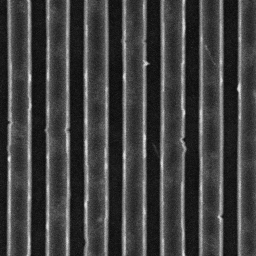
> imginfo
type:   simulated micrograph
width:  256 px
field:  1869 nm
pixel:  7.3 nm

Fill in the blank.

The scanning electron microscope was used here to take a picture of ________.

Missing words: parallel lines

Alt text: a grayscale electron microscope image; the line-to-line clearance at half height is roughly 120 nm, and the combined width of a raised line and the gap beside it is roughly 280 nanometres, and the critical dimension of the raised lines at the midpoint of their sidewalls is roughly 0.161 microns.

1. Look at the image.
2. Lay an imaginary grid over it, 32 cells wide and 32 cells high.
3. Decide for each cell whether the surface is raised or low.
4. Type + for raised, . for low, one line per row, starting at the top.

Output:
.+++..++...++..+++..+++..+++..++
.+++..++...++...++..+++..+++..++
.+++..++...++...++..+++..+++..++
.+++..++...++...++..+++..+++..++
.+++..++...++...++..+++..+++..++
.+++..++...++..+++..+++..+++..++
.+++..++...++...++..+++..+++..++
.+++..++...++...++..+++..+++..++
.+++..++...++...++..+++..+++..++
.+++..++...++..+++..+++..+++..++
.+++..++...++...++..+++..+++..++
.+++..++...++...++..+++..+++..++
.+++..++...++...++..+++..+++..++
.+++..++...++...++..+++..+++..++
.+++..++...++...++..+++..+++..++
.+++..++...++...++..+++..+++..++
.+++..++...++...++..+++..+++..++
.+++..+++..++...++..+++..+++..++
.+++..+++..++...++..+++..+++..++
.+++..+++..++..+++..+++..+++..++
.+++..+++..++...++..+++..+++..++
.+++..+++..++...++..+++..+++..++
.+++..+++..++...++..+++..+++..++
.+++..+++..++...++..+++..+++..++
.+++..+++..++...++..+++..+++..++
.+++..+++..++...++..+++..+++..++
.+++..++...++..+++..+++..+++..++
.+++..+++..++..+++..+++..+++..++
.+++..+++..++..+++..+++..+++..++
.+++..++...++..+++..+++..+++..++
.+++..++...++..+++..+++..+++..++
.+++..++...++..+++..+++..+++..++